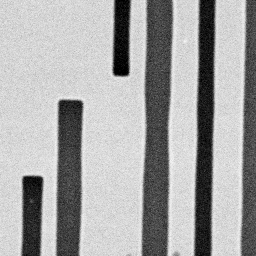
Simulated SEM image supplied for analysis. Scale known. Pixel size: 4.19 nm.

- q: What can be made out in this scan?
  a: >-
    groups of lines, slits or small figures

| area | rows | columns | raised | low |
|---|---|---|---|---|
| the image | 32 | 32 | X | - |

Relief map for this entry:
XXXXXXXXXXXXXX--XX----XXX--XXXX-
XXXXXXXXXXXXXX--XX----XXX--XXXX-
XXXXXXXXXXXXXX--XX----XXX--XXXX-
XXXXXXXXXXXXXX--XX----XXX--XXXX-
XXXXXXXXXXXXXX--XX----XXX--XXXX-
XXXXXXXXXXXXXX--XX----XXX--XXXX-
XXXXXXXXXXXXXX--XX----XXX--XXX--
XXXXXXXXXXXXXX--XX----XXX--XXX--
XXXXXXXXXXXXXX--XX----XXX--XXX--
XXXXXXXXXXXXXX--XX----XXX--XXX--
XXXXXXXXXXXXXXXXXX----XXX--XXX--
XXXXXXXXXXXXXXXXXX----XXX--XXX--
XXXXXXXX--XXXXXXXX---XXXX--XXX--
XXXXXXX---XXXXXXXX---XXXX--XXX--
XXXXXXX---XXXXXXXX---XXXX--XXX--
XXXXXXX---XXXXXXXX---XXXX--XXX--
XXXXXXX---XXXXXXXX---XXXX--XXX--
XXXXXXX---XXXXXXXX---XXXX--XXX--
XXXXXXX---XXXXXXXX---XXXX--XXX--
XXXXXXX---XXXXXXXX---XXX---XXX--
XXXXXXX---XXXXXXXX---XXX---XXX--
XXXXXXX---XXXXXXXX---XXX---XXX--
XXX--XX---XXXXXXXX---XXX---XXX--
XXX--XX---XXXXXXXX---XXX---XXX--
XXX--XX---XXXXXXXX---XXX---XXX--
XXX--XX---XXXXXXXX---XXX---XXX--
XXX--XX---XXXXXXXX---XXX---XXX--
XXX--XX---XXXXXXXX---XXX---XXX--
XXX--XX---XXXXXXXX---XXX---XXX--
XXX--XX---XXXXXXXX---XXX---XXX--
XXX--XX---XXXXXXXX---XXX---XXX--
XXX--XX---XXXXXXXX---XXX--XXXX--